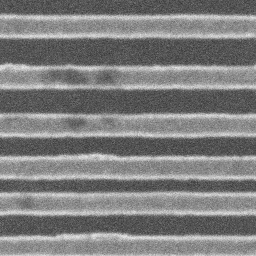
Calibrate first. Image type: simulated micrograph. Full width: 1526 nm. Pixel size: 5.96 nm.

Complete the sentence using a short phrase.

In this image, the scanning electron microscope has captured lines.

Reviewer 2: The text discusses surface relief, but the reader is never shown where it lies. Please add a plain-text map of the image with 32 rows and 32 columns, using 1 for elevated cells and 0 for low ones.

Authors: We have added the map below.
00000000000000000000000000000000
00000000000000000000000000000000
11111111111111111111111111111111
11111111111111111111111111111111
11111111111100111000010001111110
00000000000000000000000000000000
00000000000000000000000000000000
00000000000000000000000000000000
11100011110000000000011110000000
11111111111111111111111111111111
11111111111111111111111111111111
00000000000000000000000000000000
00000000000000000000000000000000
00000000000000000000000000000000
11111111100000000000011111111000
11111111111111111111111111111111
11111111111111111111111111111111
00000000000000000000000000000000
00000000000000000000000000000000
00000000001110000000000000000000
11111111111111111111111111111111
11111111111111111111111111111111
00000000000000000000000000000000
00000000000000000000000000000000
11111111111111111111111111111111
11111111111111111111111111111111
11111111111111111111111111111111
00000000000000000000000000000000
00000000000000000000000000000000
00000000111111110000000000000000
11111111111111111111111111111111
11111111111111111111111111111111